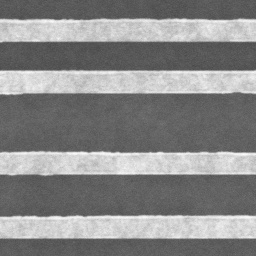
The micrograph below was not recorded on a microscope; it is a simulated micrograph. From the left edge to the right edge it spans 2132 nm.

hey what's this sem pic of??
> lines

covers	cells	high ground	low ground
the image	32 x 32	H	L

LLLLLLLLLLLLLLLLLLLLLLLLLLLLLLLL
LLLLLLLLLLLLLLLLLLLLLLLLLLLLLLLL
LLLLLLLLLLLLLLLLLLLLLLLLLLLLLLLL
HHHHHHHHHHHHHHHHHHHHHHHHHHHHHHHH
HHHHHHHHHHHHHHHHHHHHHHHHHHHHHHHH
LLLLLLLLLLLLLLLLLLLLLLLLLLLLLLLL
LLLLLLLLLLLLLLLLLLLLLLLLLLLLLLLL
LLLLLLLLLLLLLLLLLLLLLLLLLLLLLLLL
LLLLLLLLLLLLLLLLLLLLLLLLLLLLLLLL
HHHHHHHHHHHHHHHHHHHHHHHHHHHHHHHH
HHHHHHHHHHHHHHHHHHHHHHHHHHHHHHHH
HHHHHHHHHHHHHHHHHHHHHHHHHHHHLLHH
LLLLLLLLLLLLLLLLLLLLLLLLLLLLLLLL
LLLLLLLLLLLLLLLLLLLLLLLLLLLLLLLL
LLLLLLLLLLLLLLLLLLLLLLLLLLLLLLLL
LLLLLLLLLLLLLLLLLLLLLLLLLLLLLLLL
LLLLLLLLLLLLLLLLLLLLLLLLLLLLLLLL
LLLLLLLLLLLLLLLLLLLLLLLLLLLLLLLL
LLLLLLLLLLLLLLLLLLLLLLLLLLLLLLLL
HHHHHHHHHHHHHHHHHHHHHHHHHHHHHHHH
HHHHHHHHHHHHHHHHHHHHHHHHHHHHHHHH
HHHHHHHHHHHHHHHHHHHHHHHHHHHHHHHH
LLLLLLLLLLLLLLLLLLLLLLLLLLLLLLLL
LLLLLLLLLLLLLLLLLLLLLLLLLLLLLLLL
LLLLLLLLLLLLLLLLLLLLLLLLLLLLLLLL
LLLLLLLLLLLLLLLLLLLLLLLLLLLLLLLL
LLLLLLLLLLLLLLLLLLLLLLLLLLLLLLLL
HHHHHHHHHHHHHHHHHHHHHHHHHHHHHHHH
HHHHHHHHHHHHHHHHHHHHHHHHHHHHHHHH
HHHHHHHHHHHHHHHHHHHHHHHHHHHHHHHH
LLLLLLLLLLLLLLLLLLLLLLLLLLLLLLLL
LLLLLLLLLLLLLLLLLLLLLLLLLLLLLLLL